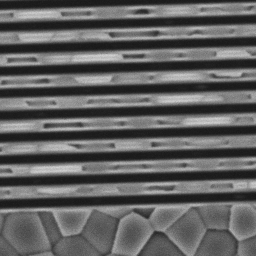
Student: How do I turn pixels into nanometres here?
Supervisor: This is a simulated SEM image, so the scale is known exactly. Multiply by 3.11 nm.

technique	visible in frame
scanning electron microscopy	parallel lines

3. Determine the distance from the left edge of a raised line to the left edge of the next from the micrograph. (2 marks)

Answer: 68.6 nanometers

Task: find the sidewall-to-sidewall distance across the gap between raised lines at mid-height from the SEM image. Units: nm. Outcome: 28.3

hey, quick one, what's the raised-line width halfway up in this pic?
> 39.6 nm